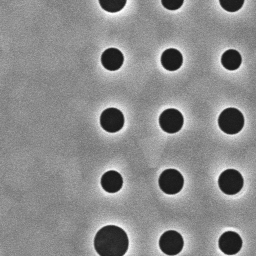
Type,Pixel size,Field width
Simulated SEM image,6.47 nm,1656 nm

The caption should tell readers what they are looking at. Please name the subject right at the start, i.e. a regular array of holes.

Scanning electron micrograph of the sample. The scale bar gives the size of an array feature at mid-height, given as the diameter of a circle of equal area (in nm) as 160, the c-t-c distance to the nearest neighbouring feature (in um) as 0.384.